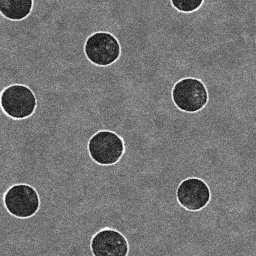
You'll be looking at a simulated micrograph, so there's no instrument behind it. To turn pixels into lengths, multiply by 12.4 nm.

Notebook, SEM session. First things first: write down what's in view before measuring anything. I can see holes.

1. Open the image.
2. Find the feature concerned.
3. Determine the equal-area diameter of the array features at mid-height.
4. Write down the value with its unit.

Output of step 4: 418 nm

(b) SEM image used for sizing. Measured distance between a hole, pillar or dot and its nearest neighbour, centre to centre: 1230 nanometres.